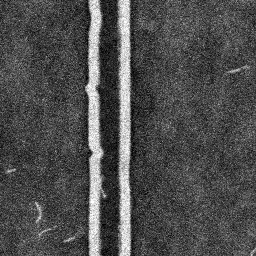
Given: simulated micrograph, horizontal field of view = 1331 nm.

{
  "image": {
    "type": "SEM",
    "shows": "one or a few lines or trenches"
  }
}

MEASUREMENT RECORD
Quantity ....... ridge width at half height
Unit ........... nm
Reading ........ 164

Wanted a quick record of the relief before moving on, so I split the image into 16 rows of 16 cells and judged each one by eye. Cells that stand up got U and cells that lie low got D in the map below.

DDDDDDUUDDDDDDDD
DDDDDDUUDDDDDDDD
DDDDDDUUDDDDDDDD
DDDDDDUUDDDDDDDD
DDDDDDUUDDDDDDDD
DDDDDDUUDDDDDDDD
DDDDDDUUDDDDDDDD
DDDDDDUUDDDDDDDD
DDDDDDUUDDDDDDDD
DDDDDDUUDDDDDDDD
DDDDDDUUDDDDDDDD
DDDDDDUUDDDDDDDD
DDDDDDUUDDDDDDDD
DDDDDDUUDDDDDDDD
DDDDDDUUDDDDDDDD
DDDDDDUUDDDDDDDD